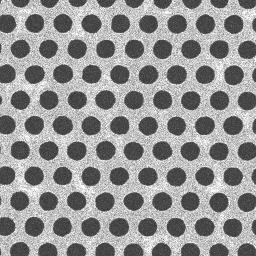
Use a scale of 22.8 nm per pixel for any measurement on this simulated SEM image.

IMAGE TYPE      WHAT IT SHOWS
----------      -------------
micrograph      a regular array of holes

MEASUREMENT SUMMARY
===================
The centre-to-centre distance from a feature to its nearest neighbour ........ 645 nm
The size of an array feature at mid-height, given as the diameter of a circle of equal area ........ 19.2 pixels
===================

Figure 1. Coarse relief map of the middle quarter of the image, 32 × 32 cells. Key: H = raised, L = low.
LHHHHHLLHHHHHLLHHHHHLLHHHHHLLHHH
LLHHHLLLLHHHLLLLHHHLLLLHHHLLLLHH
LLHHHLLLLHHLLLLLHHHLLLLLHHLLLLLH
LLHHHLLLLHHHLLLLHHHLLLLHHHLLLLLH
LHHHHLLLHHHHHLLHHHHLLLLHHHHLLLHH
HHHHHHHHHHHHHHHHHHHHHHHHHHHHHHHH
HHHHHHHHHHLHHHHHHHHHHHHHHHHHHHHH
HHLLLHHHLLLLHHHHLLLHHHHLLLLHHHLL
HLLLLLHHLLLLLHHLLLLLHHLLLLLHHLLL
HLLLLLHHLLLLLHHLLLLLHHLLLLLHHLLL
HLLLLHHHLLLLHHHHLLLLHHHLLLLHHHLL
HHHHHHHHHHLHHHHHHLHHHHHHLHHHHHHL
HHHHHHHHHHHHHHHHHHHHHHHHHHHHHHHH
LHHHHLLLHHHHHLLHHHHHLLHHHHHLLLHH
LLHHLLLLLHHHLLLLHHHLLLLHHHLLLLHH
LLHHLLLLLHHLLLLLHHLLLLLLHHLLLLLH
LLHHHLLLLHHHLLLLHHHLLLLHHHLLLLHH
LHHHHLLLHHHHHLLHHHHHLLHHHHHLLLHH
HHHHHHHHHHHHHHHHHHHHHHHHHHHHHHHH
HHLLHHHHHLLHHHHHHHHHHHHHLHHHHHHL
HLLLLHHHLLLLLHHLLLLLHHLLLLLHHHLL
HLLLLLHHLLLLLHHLLLLLHHLLLLLHHLLL
HLLLLLHHLLLLLHHLLLLLHHLLLLLHHLLL
HLLLLHHHHLLLHHHHLLLHHHHLLLHHHHLL
HHHHHHHHHHHHHHHHHHHHHHHHHHHHHHHH
HHHHHHHHHHHHHHHHHHHHHHHHHHHHHHHH
LHHHHLLLLHHHLLLLHHHLLLLHHHLLLLHH
LLHHLLLLLHHLLLLLHHHLLLLHHHLLLLHH
LLHHLLLLLHHLLLLLHHHLLLLHHHLLLLLH
LHHHHLLLLHHHLLLLHHHLLLLHHHLLLLHH
HHHHHHHHHHHHHHHHHHHHLLHHHHHLLHHH
HHHHHHHHHHHHHHHHHHHHHHHHHHHHHHHH